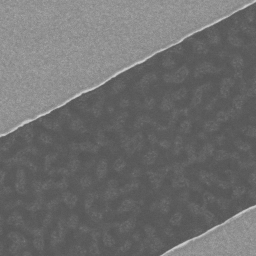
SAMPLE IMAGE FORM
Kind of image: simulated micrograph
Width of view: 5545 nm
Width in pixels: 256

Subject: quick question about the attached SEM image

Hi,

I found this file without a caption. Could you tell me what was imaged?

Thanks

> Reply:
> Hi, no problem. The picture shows one or a few lines or trenches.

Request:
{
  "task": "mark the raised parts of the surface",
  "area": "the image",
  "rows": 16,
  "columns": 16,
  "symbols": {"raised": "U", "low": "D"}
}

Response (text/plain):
UUUUUUUUUUUUUUUD
UUUUUUUUUUUUUDDD
UUUUUUUUUUUDDDDD
UUUUUUUUUDDDDDDD
UUUUUUUUDDDDDDDD
UUUUUUDDDDDDDDDD
UUUUDDDDDDDDDDDD
UUDDDDDDDDDDDDDD
DDDDDDDDDDDDDDDD
DDDDDDDDDDDDDDDD
DDDDDDDDDDDDDDDD
DDDDDDDDDDDDDDDD
DDDDDDDDDDDDDDDD
DDDDDDDDDDDDDDDU
DDDDDDDDDDDDDUUU
DDDDDDDDDDDUUUUU